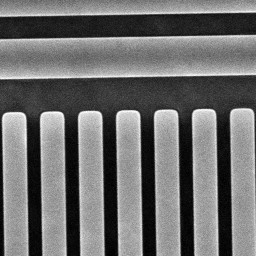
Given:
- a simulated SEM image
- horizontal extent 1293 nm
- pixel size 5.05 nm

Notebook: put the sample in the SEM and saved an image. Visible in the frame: groups of lines, slits or small figures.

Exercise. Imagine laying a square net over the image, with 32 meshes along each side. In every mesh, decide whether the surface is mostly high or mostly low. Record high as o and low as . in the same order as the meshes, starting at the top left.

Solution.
oooooooooooooooooooooooooooooooo
oooooooooooooooooooooooooooooooo
................................
................................
..........................oooooo
oooooooooooooooooooooooooooooooo
oooooooooooooooooooooooooooooooo
oooooooooooooooooooooooooooooooo
oooooooooooooooooooooooooooooooo
oooooooooooooooooo..............
................................
................................
................................
................................
.oo..ooo..ooo..oo..ooo..ooo..ooo
ooo..ooo..ooo..ooo.ooo..ooo..ooo
ooo..ooo..ooo..ooo.ooo..ooo..ooo
ooo..ooo..ooo..ooo.ooo..ooo..ooo
ooo..ooo..ooo..ooo.ooo..ooo..ooo
ooo..ooo..ooo..ooo.ooo..ooo..ooo
ooo..ooo..ooo..ooo.ooo..ooo..ooo
ooo..ooo..ooo..ooo.ooo..ooo..ooo
ooo..ooo..ooo..ooo.ooo..ooo..ooo
.oo..ooo..ooo..ooo.ooo..ooo..ooo
.oo..ooo..ooo..ooo..oo..ooo..ooo
.oo..ooo..ooo..ooo..oo..ooo..ooo
.oo..ooo..ooo..ooo..oo..ooo..ooo
.oo..ooo..ooo..ooo..oo..ooo..ooo
.oo..ooo..ooo..ooo..oo..ooo..ooo
.oo..ooo..ooo..ooo..ooo.ooo..ooo
.oo..ooo..ooo..ooo..ooo.ooo..ooo
.oo..ooo..ooo..ooo..ooo.ooo..ooo